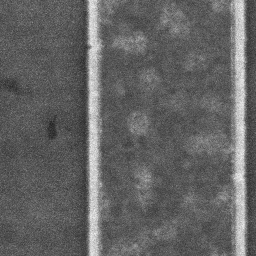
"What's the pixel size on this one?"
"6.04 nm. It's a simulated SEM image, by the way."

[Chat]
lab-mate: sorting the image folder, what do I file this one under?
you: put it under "one or a few lines or trenches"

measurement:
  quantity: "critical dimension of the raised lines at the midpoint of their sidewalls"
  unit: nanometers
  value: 894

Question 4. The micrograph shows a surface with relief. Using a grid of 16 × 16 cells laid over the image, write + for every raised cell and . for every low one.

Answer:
......+++++++++.
......+++++++++.
......+++++++++.
......+++++++++.
......+++++++++.
......+++++++++.
......+++++++++.
......+++++++++.
......+++++++++.
......+++++++++.
......+++++++++.
......+++++++++.
......+++++++++.
......+++++++++.
......+++++++++.
......+++++++++.